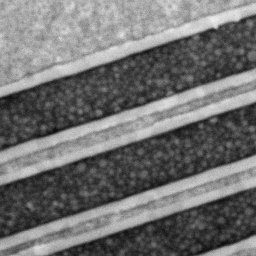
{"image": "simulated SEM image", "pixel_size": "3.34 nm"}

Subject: one or a few lines or trenches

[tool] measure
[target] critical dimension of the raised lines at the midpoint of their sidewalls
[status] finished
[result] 73.4 nm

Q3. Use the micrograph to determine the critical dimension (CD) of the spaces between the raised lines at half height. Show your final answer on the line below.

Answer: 203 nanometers